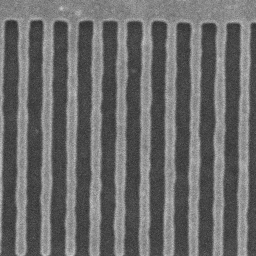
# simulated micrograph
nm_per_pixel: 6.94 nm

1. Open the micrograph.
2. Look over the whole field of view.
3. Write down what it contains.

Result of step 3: groups of lines, slits or small figures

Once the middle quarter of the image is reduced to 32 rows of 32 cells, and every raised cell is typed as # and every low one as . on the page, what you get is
.##....###...###....##....##....
.##....###...###....#.....##....
.##....##....###...###....##....
.##....##....###...###....##....
.##....##....##....###....##....
.##....##....##....###....##....
.##....##....##....###...###....
.#.....##....##....###...###....
.##....##....##....###...###....
.##....##....##....###....##....
.##....##....##....###....##....
.##....##....##....##.....##....
.##....##....##....##....###....
.##....##....##....##....###....
.##....##....##....##....###....
.##....##....##....##....###....
.##....##....##....##....###....
.##....##....##....##....###....
.##....##....##....##....###....
.##....##....##....##.....##....
.##....##....##....##.....#.....
.##....##....##....##....##.....
.##....##....##....##....##.....
.##....##....##....##....##.....
.##....##....##....##....##.....
.##....##....##....##....###...#
.##....##....##....##....###...#
.##....##....##....##....###...#
.##....##....##....##....###...#
.##....##....##....##....###...#
.##....##....##....##....##....#
.##....##....##....##....##.....